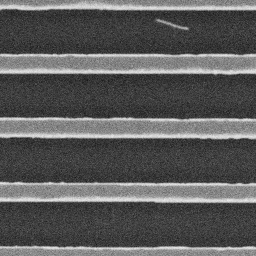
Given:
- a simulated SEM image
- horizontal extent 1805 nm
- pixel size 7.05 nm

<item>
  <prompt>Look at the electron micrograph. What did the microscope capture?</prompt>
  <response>lines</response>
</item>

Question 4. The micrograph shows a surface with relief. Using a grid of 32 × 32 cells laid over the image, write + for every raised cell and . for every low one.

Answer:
++++++++++++++++++++++++++++++++
................................
................................
................................
................................
................................
................................
++++++++++++++++++++++++++++++++
++++++++++++++++++++++++++++++++
................................
................................
................................
................................
................................
................................
++++++++++++++++++++++++++++++++
++++++++++++++++++++++++++++++++
................................
................................
................................
................................
................................
................................
++++++++++++++++++++++++++++++++
++++++++++++++++++++++++++++++++
................................
................................
................................
................................
................................
................................
++++++++++++++++++++++++++++++++